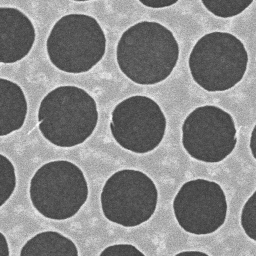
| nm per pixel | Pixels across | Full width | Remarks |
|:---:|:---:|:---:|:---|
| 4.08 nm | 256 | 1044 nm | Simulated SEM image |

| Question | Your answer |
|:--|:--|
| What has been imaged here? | a regular array of holes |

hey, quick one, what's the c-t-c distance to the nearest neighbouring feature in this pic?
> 0.291 microns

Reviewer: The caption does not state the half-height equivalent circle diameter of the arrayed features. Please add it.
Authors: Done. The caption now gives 58.4 px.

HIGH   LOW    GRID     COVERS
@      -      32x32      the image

@@@@@@@@@@@@@@@@@@----@@@------@
---@@@@@@@@@@@@@@@@@@@@@@@----@@
----@@@-----@@@@@@@@@@@@@@@@@@@@
----@@@------@@@-----@@@@@@@@@@@
----@@-------@@-------@@@----@@@
----@@-------@@-------@@------@@
----@@-------@@-------@@-------@
--@@@@------@@@-------@@-------@
@@@@@@@----@@@@-------@@-------@
@@@@@@@@@@@@@@@@-----@@@------@@
--@@@@@@@@@@@@@@@@-@@@@@@----@@@
---@@@-----@@@@@@@@@@@@@@@@@@@@@
---@@-------@@@@---@@@@@@@@@@@@@
---@@-------@@------@@@@@--@@@@@
---@@-------@@-------@@@-----@@@
---@@-------@@-------@@------@@@
--@@@-------@@-------@@------@@@
@@@@@@-----@@@------@@@------@@-
@@@@@@@@@@@@@@@@---@@@@------@@-
@@@@@@@@@@@@@@@@@@@@@@@@----@@@@
-@@@@@---@@@@@@@@@@@@@@@@@@@@@@@
--@@@-----@@@@@---@@@@@@@@@@@@@@
--@@-------@@------@@@@@--@@@@@@
--@@-------@@------@@@@-----@@@@
-@@@-------@@-------@@------@@@-
@@@@------@@@-------@@------@@@-
@@@@@-----@@@------@@@------@@--
@@@@@@@@@@@@@@----@@@@------@@--
@@@@@@@@@@@@@@@@@@@@@@@----@@@--
@@@@----@@@@@@@@@@@@@@@@@@@@@@@-
-@@------@@@@@@@@@@@@@@@@@@@@@@@
-@@-------@@@-----@@@@@--@@@@@@@